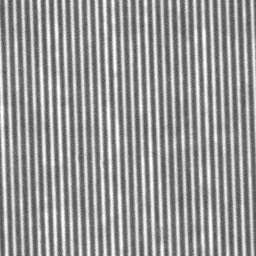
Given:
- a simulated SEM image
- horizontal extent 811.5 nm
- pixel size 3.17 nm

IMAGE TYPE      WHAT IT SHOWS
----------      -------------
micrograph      parallel lines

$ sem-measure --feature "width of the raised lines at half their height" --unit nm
4.8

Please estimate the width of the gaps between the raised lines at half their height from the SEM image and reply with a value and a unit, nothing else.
21.4 nm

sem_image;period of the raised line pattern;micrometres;0.026